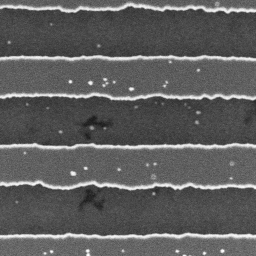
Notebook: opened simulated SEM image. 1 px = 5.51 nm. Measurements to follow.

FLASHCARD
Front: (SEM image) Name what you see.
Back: lines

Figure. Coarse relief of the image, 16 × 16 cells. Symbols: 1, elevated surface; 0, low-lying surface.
0111111101111111
0000000000000000
0000000000000000
0000000000000000
1111111111111111
1111111111111111
0000000000000000
0000000000000000
0000000000000000
1111111111111111
1111111111111111
1111111111111111
0000000000000000
0000000000000000
0000000000000000
1111111111111111